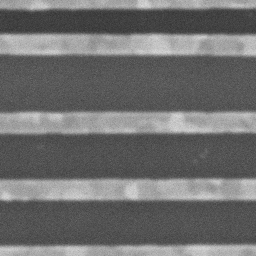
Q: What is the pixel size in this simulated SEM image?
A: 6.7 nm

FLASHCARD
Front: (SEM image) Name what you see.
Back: lines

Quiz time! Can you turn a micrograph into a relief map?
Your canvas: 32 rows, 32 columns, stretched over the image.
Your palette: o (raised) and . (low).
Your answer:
oooooooooooooooooooooooooooooooo
................................
................................
................................
oooooooooooooooooooooooooooooooo
oooooooooooooooooooooooooooooooo
oooooooooooooooooooooooooooooooo
................................
................................
................................
................................
................................
................................
................................
oooooooooooooooooooooooooooooooo
oooooooooooooooooooooooooooooooo
ooooooooooooooooooooooooooo.....
................................
................................
................................
................................
................................
......................ooooo....o
oooooooooooooooooooooooooooooooo
oooooooooooooooooooooooooooooooo
................................
................................
................................
................................
................................
................................
oooooooooooooooooooooooooooooooo